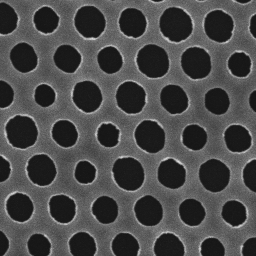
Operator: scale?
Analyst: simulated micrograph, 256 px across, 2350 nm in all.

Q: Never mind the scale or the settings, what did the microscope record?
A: a regular array of holes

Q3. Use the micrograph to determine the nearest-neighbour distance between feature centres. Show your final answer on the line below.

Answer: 392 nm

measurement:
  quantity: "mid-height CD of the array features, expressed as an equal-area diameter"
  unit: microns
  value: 0.266